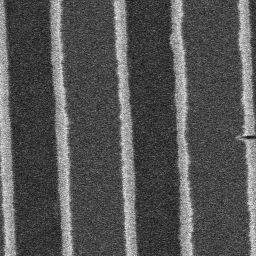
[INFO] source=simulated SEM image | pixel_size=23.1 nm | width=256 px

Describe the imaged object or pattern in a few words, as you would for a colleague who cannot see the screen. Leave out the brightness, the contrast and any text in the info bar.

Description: one or a few lines or trenches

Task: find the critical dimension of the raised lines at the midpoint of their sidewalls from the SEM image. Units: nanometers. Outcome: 1550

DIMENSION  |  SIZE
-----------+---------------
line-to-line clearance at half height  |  1260 nm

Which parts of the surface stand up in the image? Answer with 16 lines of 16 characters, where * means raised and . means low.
...*****...****.
...*****...****.
....****...****.
....****...****.
....****...****.
....****...*****
....****...*****
....****...*****
....****...*****
....****...*****
....****...*****
....****...*****
*...****....****
*...****....****
*...****....****
*...****....****